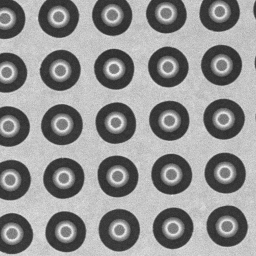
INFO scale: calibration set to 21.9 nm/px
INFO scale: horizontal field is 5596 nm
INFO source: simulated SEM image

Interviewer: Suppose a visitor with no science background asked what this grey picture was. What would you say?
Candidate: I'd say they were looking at an array of small figures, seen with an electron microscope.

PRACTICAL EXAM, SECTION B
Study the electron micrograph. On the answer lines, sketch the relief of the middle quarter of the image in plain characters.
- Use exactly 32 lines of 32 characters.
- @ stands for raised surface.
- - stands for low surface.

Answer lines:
@---@@@---@@@@@---@@@---@@@@---@
@---@@@---@@@@@---@@@---@@@@---@
@---@@@@---@@@---@@@@----@@----@
----@@@@---------@@@@@--------@@
---@@@@@@--------@@@@@@-------@@
--@@@@@@@@------@@@@@@@@----@@@@
@@@@@@@@@@@@--@@@@@@@@@@@@@@@@@@
@@@@@@@@@@@@@@@@@@@@@@@@@@@@@@@@
@@@@@@@@@@@@@@@@@@@@@@@@@@@@@@@@
@@@@@@@@@@@@@@@@@@@@@@@@@---@@@@
--@@@@@@@@------@@@@@@@-------@@
---@@@@@@--------@@@@@---------@
----@@@@---------@@@@----@@@---@
@---@@@@---@@@@---@@@---@@@@---@
@@---@@@---@@@@---@@@---@@@@---@
@@---@@@---@@@@---@@@@--@@@@---@
@----@@@----@@----@@@@---------@
----@@@@@---------@@@@@-------@@
----@@@@@--------@@@@@@@-----@@@
---@@@@@@@-----@@@@@@@@@@@@@@@@@
@@@@@@@@@@@@@@@@@@@@@@@@@@@@@@@@
@@@@@@@@@@@@@@@@@@@@@@@@@@@@@@@@
@@@@@@@@@@@@@@@@@@@@@@@@@@--@@@@
-@@@@@@@@@@-----@@@@@@@@------@@
---@@@@@@--------@@@@@@--------@
----@@@@@---------@@@@----@-----
-----@@@----@@@---@@@@---@@@@---
@@---@@@---@@@@----@@@---@@@@---
@@---@@@---@@@@----@@@---@@@@---
@@---@@@@---@@@---@@@@----@@----
@----@@@@---------@@@@---------@
----@@@@@@-------@@@@@@-------@@